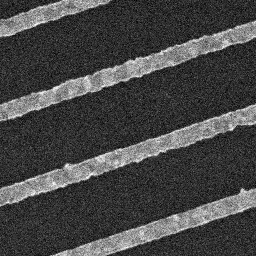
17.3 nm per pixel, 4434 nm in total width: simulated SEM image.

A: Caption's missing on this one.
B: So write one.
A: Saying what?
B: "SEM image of one or a few lines or trenches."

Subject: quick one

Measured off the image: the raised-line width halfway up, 267 nm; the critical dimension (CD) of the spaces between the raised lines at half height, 1120 nanometres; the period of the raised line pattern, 1.39 microns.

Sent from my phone